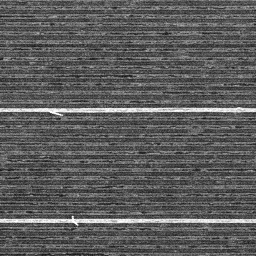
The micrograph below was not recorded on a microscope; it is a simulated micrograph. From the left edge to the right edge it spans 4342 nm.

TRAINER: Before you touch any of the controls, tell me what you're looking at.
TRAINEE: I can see parallel lines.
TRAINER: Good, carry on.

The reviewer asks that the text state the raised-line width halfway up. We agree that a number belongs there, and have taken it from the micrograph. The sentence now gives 63.6 nm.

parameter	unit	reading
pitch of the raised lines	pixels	8.53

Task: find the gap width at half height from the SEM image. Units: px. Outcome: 4.88